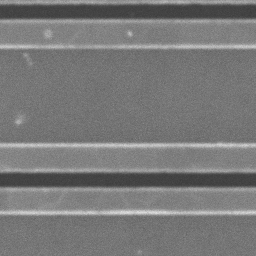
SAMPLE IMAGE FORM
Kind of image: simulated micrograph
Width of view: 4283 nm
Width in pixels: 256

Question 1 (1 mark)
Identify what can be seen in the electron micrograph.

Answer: lines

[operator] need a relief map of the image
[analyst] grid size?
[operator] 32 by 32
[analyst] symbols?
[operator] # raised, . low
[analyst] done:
................................
................................
................................
################################
################################
################################
................................
................................
................................
................................
................................
................................
................................
................................
................................
................................
................................
................................
################################
################################
################################
................................
................................
................................
################################
################################
################################
................................
................................
................................
................................
................................